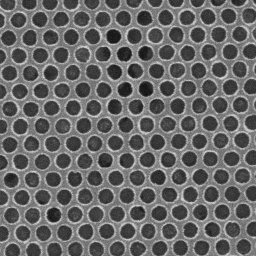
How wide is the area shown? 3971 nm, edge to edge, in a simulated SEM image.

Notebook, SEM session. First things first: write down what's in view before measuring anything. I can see a regular array of holes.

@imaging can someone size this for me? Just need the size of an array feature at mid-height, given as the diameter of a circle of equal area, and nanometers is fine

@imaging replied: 246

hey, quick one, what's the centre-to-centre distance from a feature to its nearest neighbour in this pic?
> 20.2 pixels